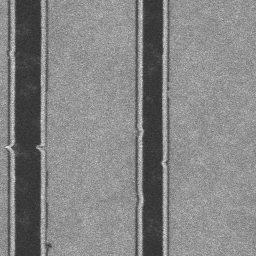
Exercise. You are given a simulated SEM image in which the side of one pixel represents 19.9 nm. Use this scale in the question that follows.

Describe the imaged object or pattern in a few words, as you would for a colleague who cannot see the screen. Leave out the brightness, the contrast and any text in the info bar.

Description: one or a few lines or trenches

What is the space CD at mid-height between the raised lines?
96.4 pixels